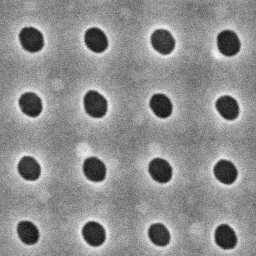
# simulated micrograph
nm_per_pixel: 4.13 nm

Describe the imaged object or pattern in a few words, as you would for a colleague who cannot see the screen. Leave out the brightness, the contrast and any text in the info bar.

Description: a regular array of holes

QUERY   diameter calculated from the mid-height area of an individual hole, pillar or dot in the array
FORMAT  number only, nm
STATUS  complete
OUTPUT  108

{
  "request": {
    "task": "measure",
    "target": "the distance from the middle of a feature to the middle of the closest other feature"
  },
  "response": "265 nm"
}